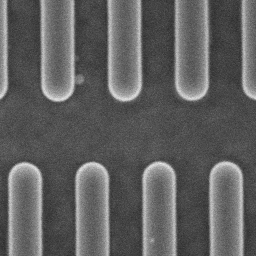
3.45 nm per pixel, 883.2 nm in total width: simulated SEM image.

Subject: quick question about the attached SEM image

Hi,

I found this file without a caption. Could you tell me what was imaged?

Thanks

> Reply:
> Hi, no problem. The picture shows groups of lines, slits or small figures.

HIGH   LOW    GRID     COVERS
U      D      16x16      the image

DDDUUDDUUDDUUDDU
DDDUUDDUUDDUUDDU
DDDUUDDUUDDUUDDU
DDDUUDDUUDDUUDDU
DDDUUDDUUDDUUDDU
DDDUUDDUUDDUUDDU
DDDDDDDDDDDDDDDD
DDDDDDDDDDDDDDDD
DDDDDDDDDDDDDDDD
DDDDDDDDDDDDDDDD
DUDDDUDDDUUDDDUD
DUUDDUUDDUUDDUUD
DUUDDUUDDUUDDUUD
DUUDDUUDDUUDDUUD
DUUDDUUDDUUDDUUD
DUUDDUUDDUUDDUUD